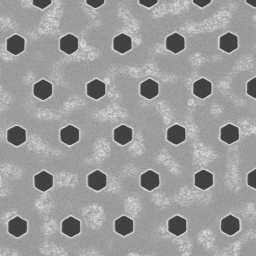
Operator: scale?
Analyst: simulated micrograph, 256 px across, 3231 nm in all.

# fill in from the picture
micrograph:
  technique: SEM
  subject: a regular array of holes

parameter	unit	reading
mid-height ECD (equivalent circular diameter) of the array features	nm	240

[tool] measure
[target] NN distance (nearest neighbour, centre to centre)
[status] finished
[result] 665 nanometers